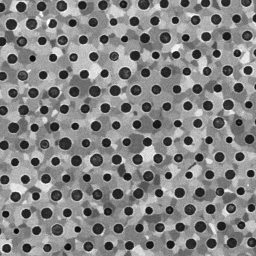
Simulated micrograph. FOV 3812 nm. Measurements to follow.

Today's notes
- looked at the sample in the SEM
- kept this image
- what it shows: a regular array of holes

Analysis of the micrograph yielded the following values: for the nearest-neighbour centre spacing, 295 nanometers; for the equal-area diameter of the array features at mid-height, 145 nm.